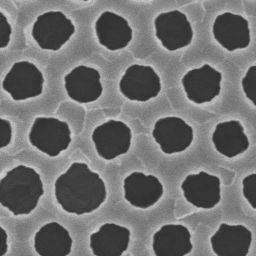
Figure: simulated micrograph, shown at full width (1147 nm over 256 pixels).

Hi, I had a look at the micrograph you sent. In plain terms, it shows a regular array of holes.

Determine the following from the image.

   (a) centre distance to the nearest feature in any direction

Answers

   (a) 261 nm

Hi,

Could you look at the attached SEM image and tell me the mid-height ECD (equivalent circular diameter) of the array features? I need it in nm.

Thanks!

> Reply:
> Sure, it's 171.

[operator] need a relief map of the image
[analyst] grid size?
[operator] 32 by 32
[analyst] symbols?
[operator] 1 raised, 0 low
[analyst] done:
11111111111111111111111111111111
11111101111110111111100111111111
01111000011100001110000111100001
01110000011100001111000011100001
01110000011100001111000011100001
01111000111110001111000011110001
11111111111111111111111111111111
11111111111111111111111111111111
10000111100111110001111110011110
10000111000011100000111000001110
00000111000001100000111000001100
10000111000001100000111000011110
11111111100011111001111100111110
11111111111111111111111111111111
11111111111111111111111111111111
01110000111110001110000111100011
01110000011100001110000011100001
01110000011100001110000011100001
11111000111100001111000111100001
11111111111110011111111111110111
11111111100111111111111111111111
10000111000011111111111110111111
00000110000001110000111000011100
00000110000001110000111000011100
00000110000001110000111000011110
00000110000001110001111100011110
10001111000111111111111111111111
11111111111111111111111111111111
11111000111110001111000111100001
01110000011000001110000011100001
01110000011000001110000011000001
01111000011100001110000011100001